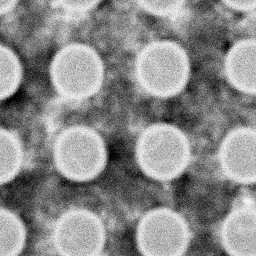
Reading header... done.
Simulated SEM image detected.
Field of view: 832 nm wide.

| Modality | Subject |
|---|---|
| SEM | raised bodies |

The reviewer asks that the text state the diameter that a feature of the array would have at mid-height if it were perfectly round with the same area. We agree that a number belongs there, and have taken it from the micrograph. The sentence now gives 173 nanometers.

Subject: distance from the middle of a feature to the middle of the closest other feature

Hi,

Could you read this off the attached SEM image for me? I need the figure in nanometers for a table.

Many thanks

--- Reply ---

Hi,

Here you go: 267